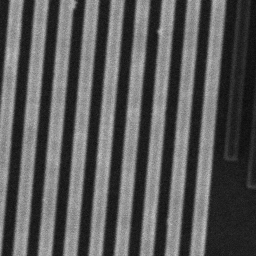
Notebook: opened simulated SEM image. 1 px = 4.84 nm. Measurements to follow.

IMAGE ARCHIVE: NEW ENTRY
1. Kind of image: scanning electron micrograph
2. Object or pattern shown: parallel lines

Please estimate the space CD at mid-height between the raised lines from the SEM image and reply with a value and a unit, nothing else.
65.7 nanometres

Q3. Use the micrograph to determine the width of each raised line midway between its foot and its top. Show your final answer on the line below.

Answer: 11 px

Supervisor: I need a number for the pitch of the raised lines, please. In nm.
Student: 122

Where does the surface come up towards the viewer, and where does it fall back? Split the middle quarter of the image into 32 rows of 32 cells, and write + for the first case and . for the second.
+...+++....++....+++...+++....++
+...+++...+++....+++...+++....++
....+++...+++....+++...+++...+++
....+++...+++....++....+++...+++
....+++...+++....++....+++...+++
....+++...+++....++....+++...+++
....++....+++....++....+++...+++
....++....+++....++....++....+++
....++....+++...+++....++....+++
....++....+++...+++....++....+++
....++....++....+++....++....+++
...+++....++....+++....++....++.
...+++....++....+++...+++....++.
...+++...+++....+++...+++...+++.
...+++...+++....++....+++...+++.
...+++...+++....++....+++...+++.
...+++...+++....++....+++...+++.
...++....+++....++....+++...+++.
...++....+++....++....++....+++.
...++....+++...+++....++....+++.
...++....+++...+++....++....+++.
...++....++....+++....++....+++.
...++....++....+++....++....++..
..+++....++....+++...+++....++..
..+++...+++....+++...+++....++..
..+++...+++....+++...+++...+++..
..+++...+++....++....+++...+++..
..+++...+++....++....+++...+++..
..+++...+++....++....+++...+++..
..++....+++....++....+++...+++..
..++....+++....++....++....+++..
..++....+++...+++....++....+++..